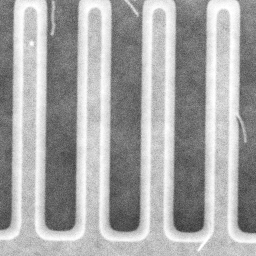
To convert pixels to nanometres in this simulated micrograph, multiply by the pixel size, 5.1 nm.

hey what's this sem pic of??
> groups of lines, slits or small figures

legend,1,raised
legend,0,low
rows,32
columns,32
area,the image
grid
00011000000110000001100000011000
00111000001110000011100000111000
00111000001110000011100000111000
00111000001110000011100000111000
00111000001110000011100000111000
00111000001110000011100000111000
00111000001110000011100000111000
00111000001110000011100000111000
00111000001110000011100000111000
00111000001110000011100000111000
00111000001110000011100000111000
00111000001110000011100000111000
00111000001110000011100000111000
00111000001110000011100000111000
00111000001110000011100000111000
00111000001110000011100000111000
00111000001110000011100000111000
00111000001110000011100000111000
00111000001110000011100000111000
00111000001110000011100000111000
00111000001110000011100000111000
00111000001110000011100000111000
00111000001110000011100000111000
00111000001110000011100000111000
00111000001110000011100000111000
00111000001110000011100000111000
00111000001110000011100000111000
00111000001110000011100000111000
00111000001110000011100000111000
11111111111111000111110001111100
11111111111111111111111111111111
11111111111111111111111111111111